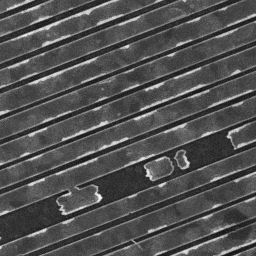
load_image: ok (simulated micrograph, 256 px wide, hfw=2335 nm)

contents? parallel lines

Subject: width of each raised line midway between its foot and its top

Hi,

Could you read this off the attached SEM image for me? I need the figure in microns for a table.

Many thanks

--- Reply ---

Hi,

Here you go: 0.167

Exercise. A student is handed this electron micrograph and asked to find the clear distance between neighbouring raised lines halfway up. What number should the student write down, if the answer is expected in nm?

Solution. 46.8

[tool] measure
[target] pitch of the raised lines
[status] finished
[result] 214 nm